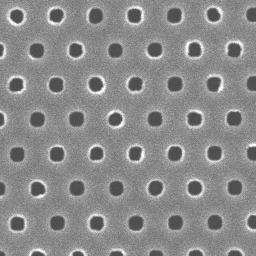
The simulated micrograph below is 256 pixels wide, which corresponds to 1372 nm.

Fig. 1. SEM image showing a regular array of holes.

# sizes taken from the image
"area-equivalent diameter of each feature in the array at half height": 14.8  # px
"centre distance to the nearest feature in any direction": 210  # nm